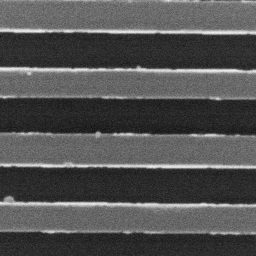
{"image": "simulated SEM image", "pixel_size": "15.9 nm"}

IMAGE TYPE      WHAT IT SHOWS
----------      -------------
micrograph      lines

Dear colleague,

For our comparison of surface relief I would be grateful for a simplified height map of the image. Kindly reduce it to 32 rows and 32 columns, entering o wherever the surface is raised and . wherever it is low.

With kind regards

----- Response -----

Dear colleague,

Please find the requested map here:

oooooooooooooooooooooooooooooooo
oooooooooooooooooooooooooooooooo
oooooooooooooooooooooooooooooooo
oooooooooooooooooooooooooooooooo
................................
................................
................................
................................
................................
oooooooooooooooooooooooooooooooo
oooooooooooooooooooooooooooooooo
oooooooooooooooooooooooooooooooo
................................
................................
................................
................................
................................
oooooooooooooooooooooooooooooooo
oooooooooooooooooooooooooooooooo
oooooooooooooooooooooooooooooooo
oooooooooooooooooooooooooooooooo
................................
................................
................................
................................
oooooooo........................
oooooooooooooooooooooooooooooooo
oooooooooooooooooooooooooooooooo
oooooooooooooooooooooooooooooooo
................................
................................
................................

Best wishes